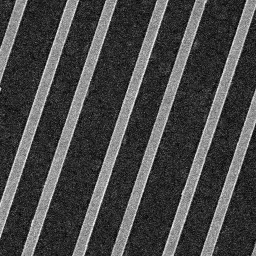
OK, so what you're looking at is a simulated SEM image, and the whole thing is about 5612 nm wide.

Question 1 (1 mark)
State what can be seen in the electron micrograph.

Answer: parallel lines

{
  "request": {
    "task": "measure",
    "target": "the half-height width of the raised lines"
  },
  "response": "10.3 px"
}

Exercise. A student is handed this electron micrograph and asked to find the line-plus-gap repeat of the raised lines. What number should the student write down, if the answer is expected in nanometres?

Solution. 926